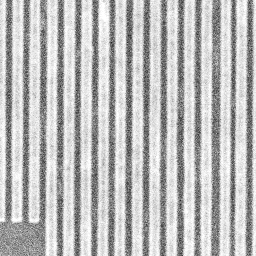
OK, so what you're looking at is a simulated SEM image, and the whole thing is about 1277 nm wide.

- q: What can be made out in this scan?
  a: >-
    parallel lines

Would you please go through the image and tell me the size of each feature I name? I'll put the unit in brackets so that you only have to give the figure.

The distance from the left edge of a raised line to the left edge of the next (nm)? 85.8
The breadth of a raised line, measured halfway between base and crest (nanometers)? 36.8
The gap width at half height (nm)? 50.5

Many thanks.